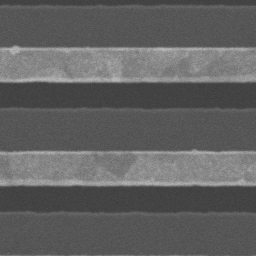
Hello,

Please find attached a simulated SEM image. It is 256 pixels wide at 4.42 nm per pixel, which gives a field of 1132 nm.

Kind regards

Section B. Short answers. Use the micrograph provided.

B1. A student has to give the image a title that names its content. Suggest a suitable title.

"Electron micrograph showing lines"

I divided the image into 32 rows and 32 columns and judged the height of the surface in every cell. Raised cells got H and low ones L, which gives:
LLLLLLLLLLLLLLLLLLLLLLLLLLLLLLLL
HHHHHHHHHHHHHHHHHHHHHHHHHHHHHHHH
HHHHHHHHHHHHHHHHHHHHHHHHHHHHHHHH
HHHHHHHHHHHHHHHHHHHHHHHHHHHHHHHH
HHHHHHHHHHHHHHHHHHHHHHHHHHHHHHHH
HHHHHHHHHHHHHHHHHHHHHHHHHHHHHHHH
HHHHHHHHHHHHHHHHHHHHHHHHHHHHHHHH
HHHHHHHHHHHHHHHHHHHHHHHHHHHHHHHH
HHHHHHHHHHHHHHHHHHHHHHHHHHHHHHHH
HHHHHHHHHHHHHHHHHHHHHHHHHHHHHHHH
LLLLLLLLLLLLLLLLLLLLLLLLLLLLLLLL
LLLLLLLLLLLLLLLLLLLLLLLLLLLLLLLL
LLLLLLLLLLLLLLLLLLLLLLLLLLLLLLLL
LLLLLLLLLLLLLLLLLLLLLLLLLLLLLLLL
HHHHHHHHHHHHHHHHHHHHHHHHHHHHHHHH
HHHHHHHHHHHHHHHHHHHHHHHHHHHHHHHH
HHHHHHHHHHHHHHHHHHHHHHHHHHHHHHHH
HHHHHHHHHHHHHHHHHHHHHHHHHHHHHHHH
HHHHHHHHHHHHHHHHHHHHHHHHHHHHHHHH
HHHHHHHHHHHHHHHHHHHHHHHHHHHHHHHH
HHHHHHHHHHHHHHHHHHHHHHHHHHHHHHHH
HHHHHHHHHHHHHHHHHHHHHHHHHHHHHHHH
HHHHHHHHHHHHHHHHHHHHHHHHHHHHHHHH
LLLLLLLLLLLLLLLLLLLLLLLLLLLLLLLL
LLLLLLLLLLLLLLLLLLLLLLLLLLLLLLLL
LLLLLLLLLLLLLLLLLLLLLLLLLLLLLLLL
LLLHLLLHLLLLLLLLLLLLLLLLLLLLLLLL
HHHHHHHHHHHHHHHHHHHHHHHHHHHHHHHH
HHHHHHHHHHHHHHHHHHHHHHHHHHHHHHHH
HHHHHHHHHHHHHHHHHHHHHHHHHHHHHHHH
HHHHHHHHHHHHHHHHHHHHHHHHHHHHHHHH
HHHHHHHHHHHHHHHHHHHHHHHHHHHHHHHH